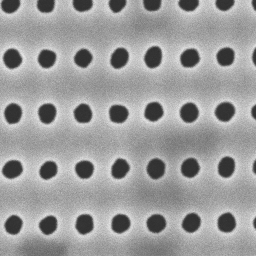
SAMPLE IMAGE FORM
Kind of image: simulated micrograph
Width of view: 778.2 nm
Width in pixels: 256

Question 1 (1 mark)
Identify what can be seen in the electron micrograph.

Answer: a regular array of holes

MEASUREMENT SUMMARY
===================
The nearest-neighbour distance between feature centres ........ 107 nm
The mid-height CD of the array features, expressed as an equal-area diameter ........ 58.3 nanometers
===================